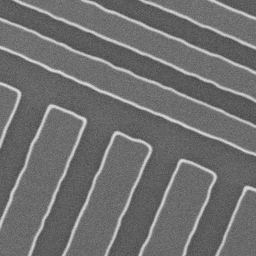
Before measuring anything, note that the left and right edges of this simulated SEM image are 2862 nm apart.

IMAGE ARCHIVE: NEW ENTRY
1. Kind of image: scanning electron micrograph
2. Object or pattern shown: groups of lines, slits or small figures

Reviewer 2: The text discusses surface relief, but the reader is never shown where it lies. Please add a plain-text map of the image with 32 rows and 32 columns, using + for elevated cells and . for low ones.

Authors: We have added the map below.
...+++++++++.......+++++++++....
.....+++++++++.......+++++++++..
........++++++++........++++++++
+++.......+++++++++.......++++++
+++++........++++++++........+++
++++++++.......+++++++++.......+
.+++++++++.......+++++++++......
....+++++++++.......++++++++....
......+++++++++.......+++++++++.
........+++++++++.......++++++++
...........+++++++++.......+++++
++...........+++++++++.......+++
++.............+++++++++........
++....+...........+++++++++.....
++....++++..........+++++++++...
+....++++++............++++++++.
+....+++++...............+++++++
....++++++....+++...........++++
....+++++.....+++++...........++
....+++++....++++++.............
...++++++....+++++....++........
...+++++....++++++....++++......
..++++++....+++++....++++++.....
..+++++.....+++++....+++++......
.++++++....+++++.....+++++....++
.+++++.....+++++....++++++....++
.+++++....++++++....+++++....+++
+++++.....+++++....++++++....+++
+++++....++++++....+++++.....+++
+++++....+++++.....+++++....++++
++++.....+++++....+++++.....++++
++++....+++++.....+++++....+++++